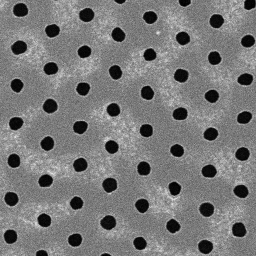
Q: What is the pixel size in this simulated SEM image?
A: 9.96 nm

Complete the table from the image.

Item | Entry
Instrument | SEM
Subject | a regular array of holes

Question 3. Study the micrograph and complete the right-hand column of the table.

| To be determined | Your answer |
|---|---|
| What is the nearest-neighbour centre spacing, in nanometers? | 368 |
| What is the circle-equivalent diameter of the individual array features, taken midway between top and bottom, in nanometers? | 137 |